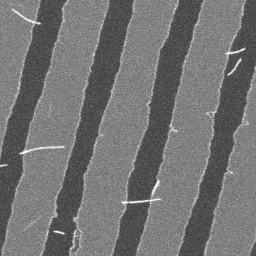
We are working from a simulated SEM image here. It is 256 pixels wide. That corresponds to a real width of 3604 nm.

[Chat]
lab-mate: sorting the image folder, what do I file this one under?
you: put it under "one or a few lines or trenches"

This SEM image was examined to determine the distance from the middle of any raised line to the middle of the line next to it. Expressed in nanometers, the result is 931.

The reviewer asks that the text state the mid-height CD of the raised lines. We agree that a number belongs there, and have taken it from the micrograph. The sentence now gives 362 nm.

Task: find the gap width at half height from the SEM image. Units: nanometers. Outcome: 566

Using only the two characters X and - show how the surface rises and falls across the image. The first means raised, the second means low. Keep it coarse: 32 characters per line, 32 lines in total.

-----XXX-----XXXX-----XXX-----XX
-----XXX-----XXXX-----XXX-----XX
----XXXX-----XXX-----XXXX-----XX
----XXXX-----XXX-----XXX------XX
----XXX-----XXXX-----XXX-----XXX
----XXX-----XXXX----XXXX-----XXX
---XXXX-----XXX-----XXXX-----XXX
---XXX------XXX-----XXX-----XXXX
---XXX-----XXXX-----XXX-----XXXX
---XXX-----XXXX----XXXX-----XXXX
--XXXX-----XXX-----XXXX-----XXX-
--XXX------XXX-----XXX-----XXXX-
--XXX-----XXXX-----XXX-----XXXX-
-XXXX-----XXX------XXX-----XXXX-
-XXX------XXX-----XXXX----XXXXX-
-XXX------XXX-----XXX------XXXX-
-XXX-----XXX------XXX------XXX--
XXX------XXX------XXX-----XXX---
XXX------XXX-----XXXX-----XXX---
XXX------XXX-----XXX------XXX---
XXX-----XXX------XXX------XXX---
XXX-----XXX-----XXXX-----XXX----
XXX-----XXX-----XXXX-----XXX----
XX------XXX-----XXXX-----XXX----
XX-----XXX------XXX------XX-----
XX-----XXX------XXX-----XXX-----
XX-----XXX-----XXXX-----XXX-----
X-----XXXX-----XXX-----XXXX-----
X-----XXXX-----XXX-----XXX------
X-----XXXX-----XXX-----XXX------
X-----XXXX----XXXX-----XXX------
-----XXXXX----XXX-----XXXX-----X